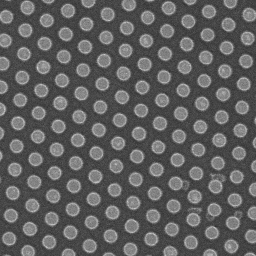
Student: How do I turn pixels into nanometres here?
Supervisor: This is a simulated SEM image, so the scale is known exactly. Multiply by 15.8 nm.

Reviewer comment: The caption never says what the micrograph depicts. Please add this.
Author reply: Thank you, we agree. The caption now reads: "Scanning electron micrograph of a regular array of raised bodies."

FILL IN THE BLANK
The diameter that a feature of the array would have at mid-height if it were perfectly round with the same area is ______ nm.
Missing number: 208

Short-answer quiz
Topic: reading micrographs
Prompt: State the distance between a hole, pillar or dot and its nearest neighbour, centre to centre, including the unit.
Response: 362 nanometers